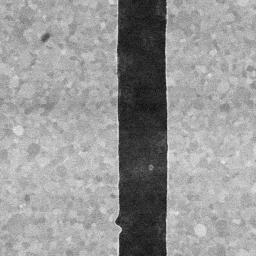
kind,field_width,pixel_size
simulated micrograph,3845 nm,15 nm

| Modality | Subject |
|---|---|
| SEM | one or a few lines or trenches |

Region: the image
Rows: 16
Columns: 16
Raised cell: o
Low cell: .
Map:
ooooooo...oooooo
ooooooo...oooooo
ooooooo...oooooo
ooooooo...oooooo
ooooooo...oooooo
oooooooo..oooooo
ooooooo...oooooo
ooooooo...oooooo
ooooooo...oooooo
ooooooo...oooooo
ooooooo...oooooo
ooooooo...oooooo
ooooooo...oooooo
ooooooo...oooooo
ooooooo...oooooo
ooooooo...oooooo